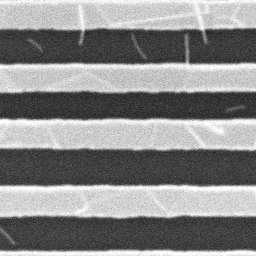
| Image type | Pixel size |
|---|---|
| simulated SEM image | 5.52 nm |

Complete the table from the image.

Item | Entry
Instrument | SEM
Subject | lines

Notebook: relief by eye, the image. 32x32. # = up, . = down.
################################
################################
################################
############.#################..
................................
................................
................................
................................
################################
################################
################################
................................
................................
................................
................................
################################
################################
################################
......####.#####################
................................
................................
................................
................................
################################
################################
################################
################################
................................
................................
................................
................................
..............###..###.......##.